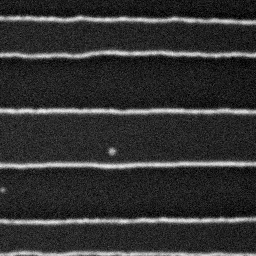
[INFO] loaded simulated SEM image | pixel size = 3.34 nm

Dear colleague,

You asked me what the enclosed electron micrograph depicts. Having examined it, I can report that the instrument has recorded lines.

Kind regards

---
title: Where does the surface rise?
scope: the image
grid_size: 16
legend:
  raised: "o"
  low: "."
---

................
oooooooooooooooo
oooooooooooooooo
.oooo...........
................
................
................
oooooooooooooooo
oooooooooooooooo
oooooooooooooooo
................
................
................
................
oooooooooooooooo
oooooooooooooooo